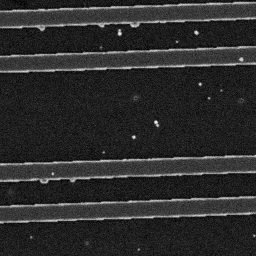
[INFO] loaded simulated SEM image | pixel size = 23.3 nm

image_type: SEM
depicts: lines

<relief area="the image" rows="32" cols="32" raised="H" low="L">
LLLLLLLLLLLLLLLLLLLLLLLLLLLHHHHH
HHHHHHHHHHHHHHHHHHHHHHHHHHHHHHHH
HHHHHHHHHHHHHHHHHHHHHHHHHHLLLLLL
LLLLLLLLLLLLLLLLLLLLLLLLLLLLLLLL
LLLLLLLLLLLLLLLLLLLLLLLLLLLLLLLL
LLLLLLLLLLLLLLLLLLLLLLLLLLLLLLLL
LLLLLLLLLLLLLLLLHHHHHHHHHHHHHHHH
HHHHHHHHHHHHHHHHHHHHHHHHHHHHHHHH
HHHHHHHHHHHHHHHHLLLLLLLLLLLLLLLL
LLLLLLLLLLLLLLLLLLLLLLLLLLLLLLLL
LLLLLLLLLLLLLLLLLLLLLLLLLLLLLLLL
LLLLLLLLLLLLLLLLLLLLLLLLLLLLLLLL
LLLLLLLLLLLLLLLLLLLLLLLLLLLLLLLL
LLLLLLLLLLLLLLLLLLLLLLLLLLLLLLLL
LLLLLLLLLLLLLLLLLLLLLLLLLLLLLLLL
LLLLLLLLLLLLLLLLLLLLLLLLLLLLLLLL
LLLLLLLLLLLLLLLLLLLLLLLLLLLLLLLL
LLLLLLLLLLLLLLLLLLLLLLLLLLLLLLLL
LLLLLLLLLLLLLLLLLLLLLLLLLLLLLLLL
LLLLLLLLLLLLLLLLLLLLLLLLLLLLLLLL
HHHHHHHHHHHHHHHHHHHHHHHHHHHHHHHH
HHHHHHHHHHHHHHHHHHHHHHHHHHHHHHHH
HHHHLHLLLLLLLLLLLLLLLLLLLLLLLLLL
LLLLLLLLLLLLLLLLLLLLLLLLLLLLLLLL
LLLLLLLLLLLLLLLLLLLLLLLLLLLLLLLL
LLLLLLLHHHHHHHHHHHHHHHHHHHHHHHHH
HHHHHHHHHHHHHHHHHHHHHHHHHHHHHHHH
HHHHHHHHHHLLLLLLLLLLLLLLLLLLLLLL
LLLLLLLLLLLLLLLLLLLLLLLLLLLLLLLL
LLLLLLLLLLLLLLLLLLLLLLLLLLLLLLLL
LLLLLLLLLLLLLLLLLLLLLLLLLLLLLLLL
LLLLLLLLLLLLLLLLLLLLLLLLLLLLLLLL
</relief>